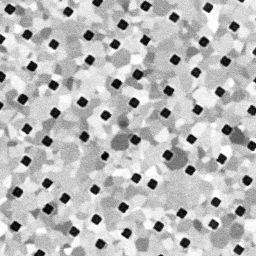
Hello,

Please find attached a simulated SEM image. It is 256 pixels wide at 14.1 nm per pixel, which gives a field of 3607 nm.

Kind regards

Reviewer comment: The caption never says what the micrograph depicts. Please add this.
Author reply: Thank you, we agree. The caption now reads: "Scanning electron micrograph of a regular array of holes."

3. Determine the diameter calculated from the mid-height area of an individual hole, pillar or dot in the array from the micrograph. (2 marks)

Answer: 152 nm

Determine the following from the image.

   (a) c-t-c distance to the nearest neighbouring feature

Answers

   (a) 379 nm